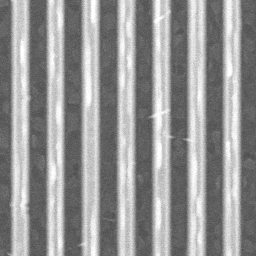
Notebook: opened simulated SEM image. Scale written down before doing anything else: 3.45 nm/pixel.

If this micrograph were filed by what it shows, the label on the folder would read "parallel lines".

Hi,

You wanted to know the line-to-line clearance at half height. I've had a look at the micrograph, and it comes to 75 nm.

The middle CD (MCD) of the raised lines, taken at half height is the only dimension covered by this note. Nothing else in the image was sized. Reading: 46.6 nm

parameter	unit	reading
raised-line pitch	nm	122